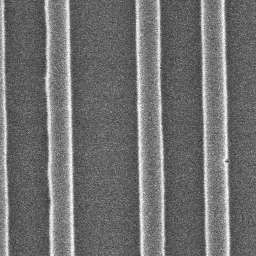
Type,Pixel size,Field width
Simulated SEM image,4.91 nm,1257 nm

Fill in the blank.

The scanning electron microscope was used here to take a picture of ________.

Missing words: one or a few lines or trenches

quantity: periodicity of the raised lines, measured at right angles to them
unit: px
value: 77.7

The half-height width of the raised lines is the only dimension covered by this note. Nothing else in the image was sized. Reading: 107 nm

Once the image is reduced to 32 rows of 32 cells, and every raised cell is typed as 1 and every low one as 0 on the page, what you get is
00000011000000000111000001110000
00000011000000000111000001110000
00000011000000000111000001110000
00000011100000000111000001110000
00000011100000000111000001110000
00000011100000000111000001110000
00000011100000000111000001110000
00000011100000000111000001110000
00000011100000000111000000110000
00000011100000000111000001110000
10000011100000000111000001110000
10000011100000000111000001110000
00000011100000000111000001110000
10000011100000000111000001110000
10000011100000000111000000110000
10000011100000000111000000110000
10000011100000000111000000110000
10000011100000000111000000110000
10000011100000000111000000110000
10000011100000000011000000110000
10000011100000000011000000110000
10000011100000000011000000110000
10000011100000000011000000110000
10000011100000000011000000110000
10000011100000000011000000110000
10000011100000000011000000110000
10000011100000000011000000110000
10000011100000000011000000110000
10000011100000000011000000110000
10000011100000000011000000111000
10000011100000000011000000111000
10000011100000000011000000110000